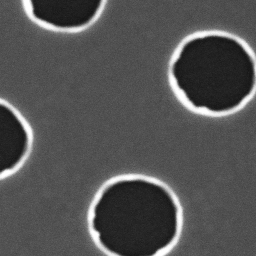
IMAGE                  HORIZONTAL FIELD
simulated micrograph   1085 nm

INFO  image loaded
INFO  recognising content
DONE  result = holes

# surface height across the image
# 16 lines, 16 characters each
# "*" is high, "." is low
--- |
**....**********
***..***********
************...*
***********.....
***********.....
***********.....
************...*
.***************
..**************
..**************
.***************
*******...******
******.....*****
******.....*****
******.....*****
*******...******